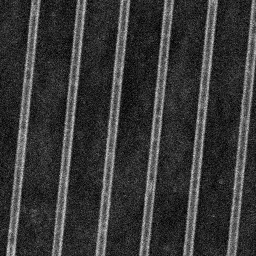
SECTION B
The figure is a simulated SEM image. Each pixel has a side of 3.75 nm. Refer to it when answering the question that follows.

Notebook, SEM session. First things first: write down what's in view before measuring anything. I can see parallel lines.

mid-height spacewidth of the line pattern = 35.9 pixels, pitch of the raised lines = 165 nm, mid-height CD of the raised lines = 29.4 nm